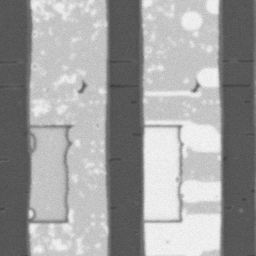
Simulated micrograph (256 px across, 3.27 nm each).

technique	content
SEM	wiring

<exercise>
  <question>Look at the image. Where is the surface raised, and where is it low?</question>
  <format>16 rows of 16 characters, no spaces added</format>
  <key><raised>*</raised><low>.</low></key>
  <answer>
..*****..*****..
..*****..*****..
..*****..*****..
..*****..*****..
..*****..*****..
..*****..*****..
..*****..*****..
..*****..*****..
....***....***..
....***....***..
....***....***..
....***....***..
....***....***..
....***....***..
..*****..*****..
..*****..*****..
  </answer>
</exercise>